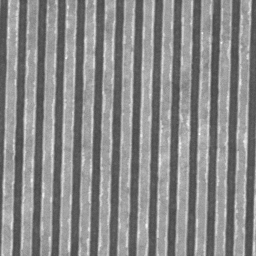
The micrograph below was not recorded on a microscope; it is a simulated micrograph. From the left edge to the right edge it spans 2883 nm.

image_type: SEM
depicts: parallel lines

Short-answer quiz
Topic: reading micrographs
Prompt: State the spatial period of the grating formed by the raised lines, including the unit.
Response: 218 nanometres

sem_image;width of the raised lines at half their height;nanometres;115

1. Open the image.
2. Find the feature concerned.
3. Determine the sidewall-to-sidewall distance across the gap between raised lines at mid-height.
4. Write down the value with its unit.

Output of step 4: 104 nanometers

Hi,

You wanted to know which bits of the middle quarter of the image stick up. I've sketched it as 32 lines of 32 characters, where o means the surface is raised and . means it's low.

ooo..ooo..oo...oo...oo...oo..ooo
ooo..oo...oo...oo...oo...oo..ooo
ooo..oo...oo...oo...oo...oo..ooo
oo...oo...oo...oo...oo...oo..ooo
oo...oo...oo...oo...oo...oo..ooo
ooo..oo...oo...oo...oo..ooo..ooo
oo...oo...oo...oo...oo..ooo..oo.
oo...oo...oo...oo...oo..ooo..ooo
oo...oo...oo...oo...oo..ooo..oo.
oo...oo...oo...oo..ooo..ooo..oo.
oo...oo...oo...oo..ooo..ooo..oo.
ooo..oo...oo...oo..ooo..ooo..oo.
oo...oo...oo...oo..ooo..ooo..oo.
oo...oo...oo...oo..ooo..ooo..oo.
oo...oo...oo..ooo..ooo..oo...oo.
oo...oo...oo..ooo..ooo..oo...oo.
oo...oo...oo..ooo..ooo..oo...oo.
oo...oo...oo..ooo..ooo..oo...oo.
oo...oo...oo..ooo..ooo..oo...oo.
oo...oo..ooo..ooo..ooo..oo...oo.
oo...oo..ooo..ooo..ooo..oo...oo.
oo...oo..ooo..ooo..oo...oo...oo.
oo...oo..ooo..ooo..oo...oo...oo.
oo...oo..ooo..ooo..oo...oo...oo.
oo..ooo..ooo..ooo..oo...oo...oo.
oo..ooo..ooo..ooo..oo...oo...oo.
oo...oo..ooo..oo...oo...oo...oo.
oo..ooo..ooo..oo...oo...oo...oo.
oo..ooo..ooo..oo...oo...oo...oo.
oo..ooo..ooo..oo...oo...oo...oo.
oo..ooo..oo...oo...oo...oo..ooo.
oo..ooo..oo...oo...oo...oo..ooo.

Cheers